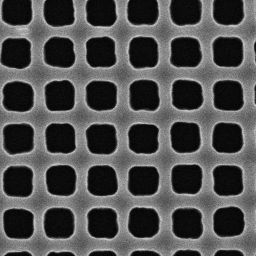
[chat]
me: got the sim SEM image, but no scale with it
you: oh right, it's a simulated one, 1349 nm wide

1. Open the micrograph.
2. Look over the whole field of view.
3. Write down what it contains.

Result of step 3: a regular array of holes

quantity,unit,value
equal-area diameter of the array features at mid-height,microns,0.169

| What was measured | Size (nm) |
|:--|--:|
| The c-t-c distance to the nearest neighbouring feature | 217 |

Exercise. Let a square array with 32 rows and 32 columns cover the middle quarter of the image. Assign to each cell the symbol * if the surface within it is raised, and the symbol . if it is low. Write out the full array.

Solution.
..*****.....*****......*****....
********************************
********************************
********************************
.******.....*****......*****....
..****.......***.......****.....
...***.......***.......****.....
...***.......***.......****.....
...***.......***........***.....
...***.......***........***.....
..****.......****.......****....
..******..***********..******...
********************************
********************************
*****************************.**
..*****.....*****......****.....
...***.......***........***.....
...**........***........***.....
...***.......***........***.....
...***.......***........***.....
...***.......***........***.....
...***.......****......****.....
********.*.*******....**********
********************************
********************************
.********..*****************....
...***.......***.......****.....
...***.......***........***.....
...***.......***........***.....
...***.......***........***.....
...***.......***........***.....
...***.......***.......****.....